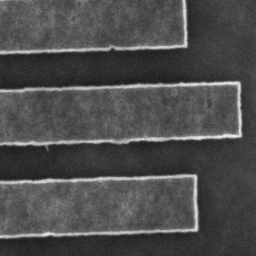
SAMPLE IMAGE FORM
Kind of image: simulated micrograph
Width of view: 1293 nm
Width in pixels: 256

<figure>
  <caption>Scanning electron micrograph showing one or a few lines or trenches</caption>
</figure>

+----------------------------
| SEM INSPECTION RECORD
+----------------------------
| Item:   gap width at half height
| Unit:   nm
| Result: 194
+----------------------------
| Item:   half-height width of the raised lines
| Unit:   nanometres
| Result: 271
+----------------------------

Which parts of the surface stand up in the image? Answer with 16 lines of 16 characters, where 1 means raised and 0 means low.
1111111111110000
1111111111110000
1111111111110000
0000000000000000
0000000000000000
0000001111111110
1111111111111110
1111111111111110
1111111111111100
0000000000000000
0000000000000000
1111111111110000
1111111111110000
1111111111110000
1111111110000000
0000000000000000